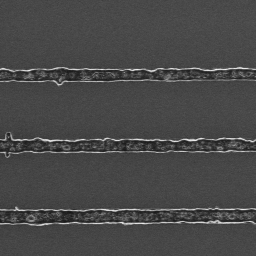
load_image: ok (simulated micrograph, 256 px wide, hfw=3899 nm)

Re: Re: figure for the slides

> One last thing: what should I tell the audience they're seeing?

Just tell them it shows one or a few lines or trenches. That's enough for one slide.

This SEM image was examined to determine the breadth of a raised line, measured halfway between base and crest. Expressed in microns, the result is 0.196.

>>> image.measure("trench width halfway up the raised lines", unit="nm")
884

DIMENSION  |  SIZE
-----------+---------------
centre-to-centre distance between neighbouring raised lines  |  1080 nm